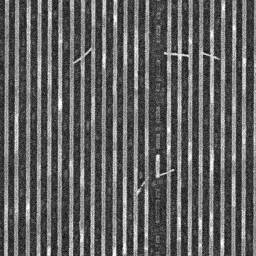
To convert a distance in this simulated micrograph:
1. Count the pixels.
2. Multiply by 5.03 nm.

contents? parallel lines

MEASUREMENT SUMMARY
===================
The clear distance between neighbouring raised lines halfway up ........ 40.9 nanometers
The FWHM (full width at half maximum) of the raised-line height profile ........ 0.0164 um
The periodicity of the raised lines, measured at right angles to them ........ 54.3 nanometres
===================